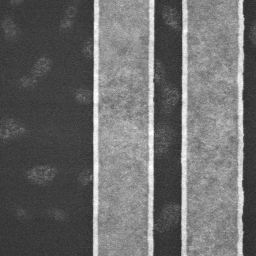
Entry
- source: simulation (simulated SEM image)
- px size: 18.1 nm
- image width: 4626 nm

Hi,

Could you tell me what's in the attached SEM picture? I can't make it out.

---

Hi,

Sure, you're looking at one or a few lines or trenches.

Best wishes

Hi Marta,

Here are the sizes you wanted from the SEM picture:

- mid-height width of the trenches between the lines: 0.594 micrometres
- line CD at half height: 1010 nanometers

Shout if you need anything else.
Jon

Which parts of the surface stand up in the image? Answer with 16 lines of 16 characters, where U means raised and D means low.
DDDDDDUUUDDDUUUD
DDDDDDUUUDDDUUUD
DDDDDDUUUDDDUUUD
DDDDDDUUUDDDUUUD
DDDDDDUUUDDDUUUD
DDDDDDUUUDDDUUUD
DDDDDDUUUDDDUUUD
DDDDDDUUUDDDUUUD
DDDDDDUUUDDDUUUD
DDDDDDUUUDDDUUUD
DDDDDDUUUDDUUUUD
DDDDDDUUUDDDUUUD
DDDDDDUUUDDDUUUD
DDDDDDUUUDDDUUUD
DDDDDDUUUDDDUUUD
DDDDDDUUUDDDUUUD